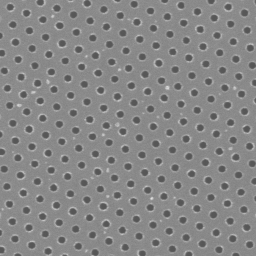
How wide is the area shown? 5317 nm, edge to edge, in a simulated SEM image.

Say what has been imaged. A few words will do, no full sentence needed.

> a regular array of holes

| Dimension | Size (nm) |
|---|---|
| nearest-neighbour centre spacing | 361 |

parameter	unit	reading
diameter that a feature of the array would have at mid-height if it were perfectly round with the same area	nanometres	154